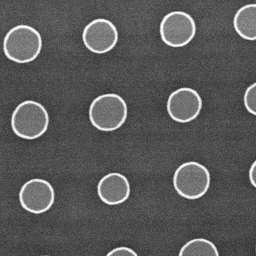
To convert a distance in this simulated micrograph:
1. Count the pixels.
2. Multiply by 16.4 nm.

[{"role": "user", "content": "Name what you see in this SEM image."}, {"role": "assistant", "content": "a regular array of raised bodies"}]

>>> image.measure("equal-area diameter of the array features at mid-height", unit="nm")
554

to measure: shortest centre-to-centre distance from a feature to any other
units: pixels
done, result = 76.3